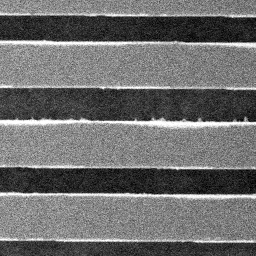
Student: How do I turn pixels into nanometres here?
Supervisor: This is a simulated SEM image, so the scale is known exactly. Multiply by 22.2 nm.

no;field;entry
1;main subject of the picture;lines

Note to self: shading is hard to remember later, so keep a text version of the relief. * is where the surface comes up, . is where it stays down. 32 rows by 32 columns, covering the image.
********************************
********************************
................................
................................
................................
*******************************.
********************************
********************************
********************************
********************************
********************************
................................
................................
................................
................................
********************************
********************************
********************************
********************************
********************************
********************************
................................
................................
................................
**************************......
********************************
********************************
********************************
********************************
********************************
................................
................................